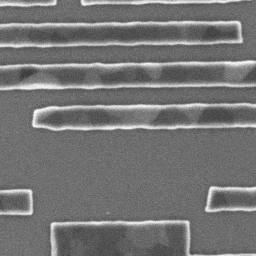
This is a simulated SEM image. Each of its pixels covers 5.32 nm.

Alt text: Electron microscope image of wiring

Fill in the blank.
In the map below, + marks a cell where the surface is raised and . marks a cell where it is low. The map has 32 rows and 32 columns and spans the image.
+++++++....+....................
................................
................................
++++++++++++++++++++++++++++++..
++++++++++++++++++++++++++++++..
+++++++++++++++++++++++++++.....
................................
................................
++++++++++++++++++++++++++++++++
++++++++++++++++++++++++++++++++
++++++++++++++++++++++++++++++++
................................
................................
.....+++++++++++++++++++++++++++
....++++++++++++++++++++++++++++
....++++++++++++++++++++++++++++
................................
................................
................................
................................
................................
................................
................................
...........................+....
++++......................++++++
++++......................++++++
++++............................
................................
......++++++++++++++++++........
......++++++++++++++++++........
......++++++++++++++++++........
.......+++++++++++++++++........